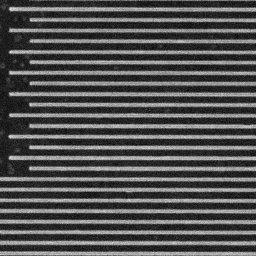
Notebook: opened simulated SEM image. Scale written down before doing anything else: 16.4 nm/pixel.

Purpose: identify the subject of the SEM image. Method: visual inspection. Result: parallel lines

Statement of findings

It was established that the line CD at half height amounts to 41 nanometers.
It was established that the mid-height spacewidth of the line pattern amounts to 0.14 micrometres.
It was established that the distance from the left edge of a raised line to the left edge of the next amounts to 174 nanometres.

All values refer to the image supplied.